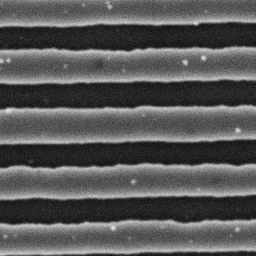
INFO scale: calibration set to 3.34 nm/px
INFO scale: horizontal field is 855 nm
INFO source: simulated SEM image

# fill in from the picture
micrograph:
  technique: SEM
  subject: lines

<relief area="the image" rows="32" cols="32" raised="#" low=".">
################################
################################
################################
................................
................................
................................
################################
################################
################################
################################
................................
................................
................................
.............#...###############
################################
################################
################################
###########################.....
................................
................................
..................#.............
################################
################################
################################
####################.......#....
................................
................................
................................
################################
################################
################################
##################..............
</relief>